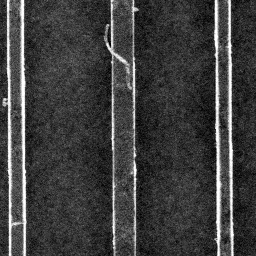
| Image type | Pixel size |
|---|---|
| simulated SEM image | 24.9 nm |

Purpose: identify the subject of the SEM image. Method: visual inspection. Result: lines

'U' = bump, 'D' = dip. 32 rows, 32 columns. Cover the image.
DUUDDDDDDDDDDDUUUDDDDDDDDDDUUDDD
DUUDDDDDDDDDDDUUUDDDDDDDDDDUUDDD
DUUDDDDDDDDDDDUUUDDDDDDDDDDUUDDD
DUUDDDDDDDDDDDUUUDDDDDDDDDDUUDDD
DUUDDDDDDDDDDDUUUDDDDDDDDDDUUDDD
DUUDDDDDDDDDDDUUUDDDDDDDDDDUUDDD
DUUDDDDDDDDDDDUUUDDDDDDDDDDUUDDD
DUUDDDDDDDDDDDUUUDDDDDDDDDDUUDDD
DUUDDDDDDDDDDDUUUDDDDDDDDDDUUDDD
DUUDDDDDDDDDDDUUUDDDDDDDDDDUUDDD
DUUDDDDDDDDDDDUUUDDDDDDDDDDUUDDD
DUUDDDDDDDDDDDUUUDDDDDDDDDDUUDDD
DUUDDDDDDDDDDDUUUDDDDDDDDDDUUDDD
DUUDDDDDDDDDDDUUUDDDDDDDDDDUUDDD
DUUDDDDDDDDDDDUUUDDDDDDDDDDUUDDD
DUUDDDDDDDDDDDUUUDDDDDDDDDDUUDDD
DUUDDDDDDDDDDDUUUDDDDDDDDDDUUDDD
DUUDDDDDDDDDDDUUUDDDDDDDDDDUUDDD
DUUDDDDDDDDDDDUUUDDDDDDDDDDUUDDD
DUUDDDDDDDDDDDUUUDDDDDDDDDDUUDDD
DUUDDDDDDDDDDDUUUDDDDDDDDDDUUDDD
DUUDDDDDDDDDDDUUUDDDDDDDDDDUUDDD
DUUDDDDDDDDDDDUUUDDDDDDDDDDUUDDD
DUUDDDDDDDDDDDUUUDDDDDDDDDDUUDDD
DUUDDDDDDDDDDDUUUDDDDDDDDDDUUDDD
DUUDDDDDDDDDDDUUUDDDDDDDDDDUUDDD
DUUDDDDDDDDDDDUUUDDDDDDDDDDUUDDD
DUUDDDDDDDDDDDUUUDDDDDDDDDDUUDDD
DUUDDDDDDDDDDDUUUDDDDDDDDDDUUDDD
DUUDDDDDDDDDDDUUUDDDDDDDDDDUUDDD
DUUDDDDDDDDDDDUUUDDDDDDDDDDUUDDD
DUUDDDDDDDDDDDUUUDDDDDDDDDDUUDDD